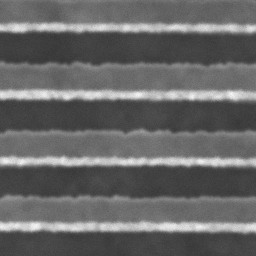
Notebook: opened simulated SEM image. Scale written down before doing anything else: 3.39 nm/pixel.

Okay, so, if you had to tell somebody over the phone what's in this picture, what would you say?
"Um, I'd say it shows lines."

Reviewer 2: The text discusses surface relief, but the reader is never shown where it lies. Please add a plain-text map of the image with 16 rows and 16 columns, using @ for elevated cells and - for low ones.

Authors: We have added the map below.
@@@@@@@@@@@@@@@@
@@@@@@@@@@@@@@@@
----------------
----------------
@@@@@@@@@@@@@@@@
@@@@@@@@@@@@@@@@
----------------
----------------
@@@@@@@@@@@@@@@@
@@@@@@@@@@@@@@@@
----------------
----------------
@@@@@@@@@@@@@@@@
@@@@@@@@@@@@@@@@
----------------
----------------